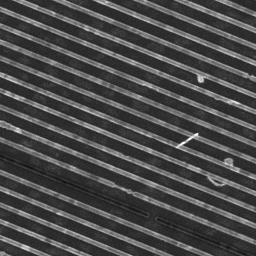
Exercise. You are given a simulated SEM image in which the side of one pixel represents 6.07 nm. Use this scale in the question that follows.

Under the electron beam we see parallel lines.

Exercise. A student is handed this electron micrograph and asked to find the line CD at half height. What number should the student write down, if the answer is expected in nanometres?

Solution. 22.5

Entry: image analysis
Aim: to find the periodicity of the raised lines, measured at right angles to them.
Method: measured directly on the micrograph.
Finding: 91.8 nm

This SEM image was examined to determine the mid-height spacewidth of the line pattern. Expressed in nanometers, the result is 66.7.